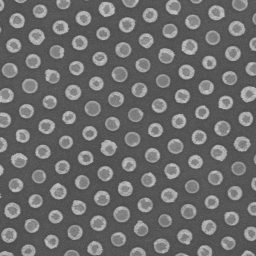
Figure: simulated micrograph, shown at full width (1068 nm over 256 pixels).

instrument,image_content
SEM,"a regular array of raised bodies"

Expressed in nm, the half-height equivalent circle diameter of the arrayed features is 58.7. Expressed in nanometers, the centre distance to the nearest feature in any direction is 103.